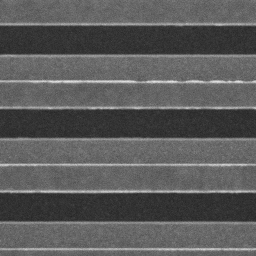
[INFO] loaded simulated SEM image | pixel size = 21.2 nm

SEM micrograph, lines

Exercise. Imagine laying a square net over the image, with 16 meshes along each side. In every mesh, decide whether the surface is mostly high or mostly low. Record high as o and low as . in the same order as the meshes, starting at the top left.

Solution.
oooooooooooooooo
oooooooooooooooo
................
o...............
oooooooooooooooo
oooooooooooooooo
oooooooooooooooo
................
................
oooooooooooooooo
oooooooooooooooo
oooooooooooooooo
................
................
oooooooooooooooo
oooooooooooooooo